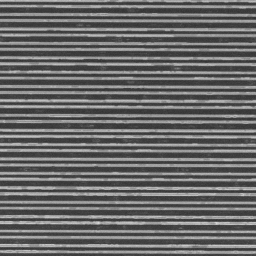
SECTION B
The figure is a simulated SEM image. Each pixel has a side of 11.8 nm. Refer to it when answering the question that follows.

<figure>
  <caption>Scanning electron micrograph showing parallel lines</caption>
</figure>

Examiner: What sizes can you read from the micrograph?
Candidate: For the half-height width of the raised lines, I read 23.6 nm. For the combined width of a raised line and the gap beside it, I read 7.23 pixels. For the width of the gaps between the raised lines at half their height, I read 47.2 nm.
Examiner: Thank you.